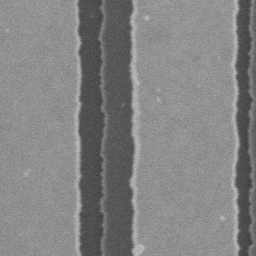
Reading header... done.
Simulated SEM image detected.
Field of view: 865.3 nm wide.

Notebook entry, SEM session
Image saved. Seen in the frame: lines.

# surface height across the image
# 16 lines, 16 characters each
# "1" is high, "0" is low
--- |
1111100011111110
1111100011111110
1111100011111110
1111100011111110
1111100011111110
1111100011111110
1111100011111110
1111100011111110
1111100011111110
1111100011111110
1111100011111110
1111100011111110
1111100011111110
1111100011111110
1111100011111110
1111100011111110